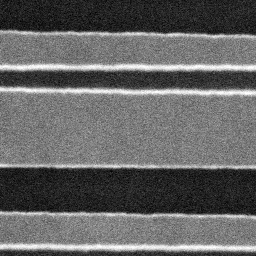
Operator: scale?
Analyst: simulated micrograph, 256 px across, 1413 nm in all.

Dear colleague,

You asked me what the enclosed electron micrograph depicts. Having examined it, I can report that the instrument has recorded lines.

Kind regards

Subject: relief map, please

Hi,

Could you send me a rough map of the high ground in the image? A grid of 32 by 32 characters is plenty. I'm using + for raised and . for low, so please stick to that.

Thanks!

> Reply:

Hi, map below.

................................
................................
................................
................................
++++++++++++++++++++++++++++++++
++++++++++++++++++++++++++++++++
++++++++++++++++++++++++++++++++
++++++++++++++++++++++++++++++++
++++++++++++++++++++++++++++++++
................................
+.+.............................
++++++++++++++++++++++++++++++++
++++++++++++++++++++++++++++++++
++++++++++++++++++++++++++++++++
++++++++++++++++++++++++++++++++
++++++++++++++++++++++++++++++++
++++++++++++++++++++++++++++++++
++++++++++++++++++++++++++++++++
++++++++++++++++++++++++++++++++
++++++++++++++++++++++++++++++++
++++++++++++++++++++++++++++++++
................................
................................
................................
................................
................................
................................
++++++++++++++++++++++++++++++++
++++++++++++++++++++++++++++++++
++++++++++++++++++++++++++++++++
++++++++++++++++++++++++++++++++
................................